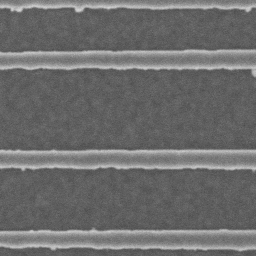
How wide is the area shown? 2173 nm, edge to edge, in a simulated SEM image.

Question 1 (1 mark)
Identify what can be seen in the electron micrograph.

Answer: lines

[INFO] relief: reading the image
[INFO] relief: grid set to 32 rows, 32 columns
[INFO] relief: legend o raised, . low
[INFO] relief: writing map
oooooooooooooooooooooooooooooooo
................................
................................
................................
................................
................................
....o.o...oooooooooooooooooooooo
oooooooooooooooooooooooooooooooo
ooooooooooo.oooooooooooooooooooo
................................
................................
................................
................................
................................
................................
................................
................................
................................
................................
oooooooooooooooooooooooooooooooo
oooooooooooooooooooooooooooooooo
................................
................................
................................
................................
................................
................................
................................
................................
oooooooooooooooooooooooooooooooo
oooooooooooooooooooooooooooooooo
................................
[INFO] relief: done